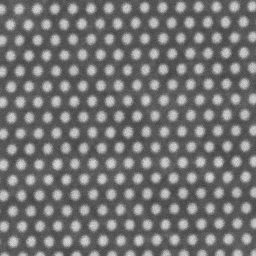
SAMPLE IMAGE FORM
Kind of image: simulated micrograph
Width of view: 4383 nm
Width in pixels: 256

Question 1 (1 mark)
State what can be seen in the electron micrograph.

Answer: a regular array of raised bodies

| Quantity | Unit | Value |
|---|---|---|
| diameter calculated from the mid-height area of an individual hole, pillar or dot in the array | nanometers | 158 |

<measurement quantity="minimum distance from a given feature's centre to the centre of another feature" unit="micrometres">0.301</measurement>